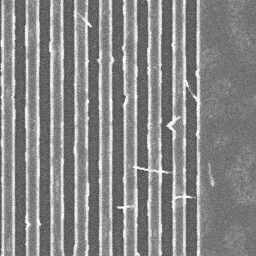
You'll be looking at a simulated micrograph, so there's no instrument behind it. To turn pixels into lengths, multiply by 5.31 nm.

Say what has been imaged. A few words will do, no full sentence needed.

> parallel lines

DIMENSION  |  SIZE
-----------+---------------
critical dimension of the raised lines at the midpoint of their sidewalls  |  67 nm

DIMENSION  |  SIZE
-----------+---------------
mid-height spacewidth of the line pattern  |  61.7 nanometres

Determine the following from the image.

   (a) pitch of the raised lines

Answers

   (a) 130 nm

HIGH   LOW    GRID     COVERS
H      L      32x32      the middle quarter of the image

LLLHHHLLLHHHLLLHHHLLLHHHLLLHHHLL
LLLHHHLLLHHHLLLHHHLLLHHHLLLHHHLL
LLLHHHLLLHHHLLLHHHLLLHHHLLLHHHLL
LLLHHHLLLHHHLLLHHHLLLHHHLLLHHHLL
LLLHHHLLLHHHLLLHHHLLLHHHLLLHHHHL
LLLHHHLLLHHHLLLHHHLLLHHHLLLHHHHL
LLLHHHLLLHHHLLLHHHLLLHHHLLLHHHLL
LLLHHHLLLHHHLLLHHHLLLHHHLLLHHHLL
LLLHHHLLLHHHLLLHHHLLLHHHLLLHHHLL
LLLHHHLLLHHHLLLHHHLLLHHHLLLHHHLL
LLLHHHLLLHHHLLLHHHLLLHHHLLLHHHLL
LLLHHHLLLHHHLLLHHHLLLHHHLLLHHHLL
LLLHHHLLLHHHLLLHHHLLLHHHLLLHHHLL
LLLHHHLLLHHHLLLHHHLLLHHHLLLHHHLL
LLLHHHLLLHHHLLLHHHLLLHHHLLLHHHLL
LLLHHHLLLHHHLLLHHHLLLHHHLLHHHHLL
LLLHHHLLLHHHLLLHHHLLLHHHLLLHHHLL
LLLHHHLLLHHHLLLHHHLLLHHHLLLHHHLL
LLLHHHLLLHHHLLLHHHLLLHHHLLLHHHLL
LLLHHHLLLHHHLLLHHHLLLHHHLLLHHHLL
LLLHHHLLLHHHLLLHHHLLLHHHLLLHHHLL
LLLHHHLLLHHHLLLHHHLLLHHHLLLHHHLL
LLLHHHLLLHHHLLLHHHLLLHHHLLLHHHLL
LLLHHHLLLHHHLLLHHHLLLHHHLLLHHHLL
LLLHHHLLLHHHLLLHHHLLLHHHLLLLHHLL
LLLHHHLLLHHHLLLHHHLLLHHHLLLLHHLL
LLLHHHLLLHHHLLLHHHLLLHHHHLLHHHLL
LLLHHHLLLHHHLLLHHHLLLHHHHLLHHHLL
LLLHHHLLLHHHLLLHHHLLLHHHLLLLHHLL
LLLHHHLLLHHHLLLHHHLLLHHHLLLHHHLL
LLLHHHLLLHHHLLLHHHLLLHHHLLLHHHLL
LLLHHHLLLHHHLLLHHHLLLHHHLLLHHHLL